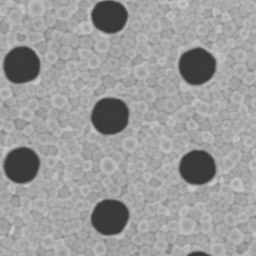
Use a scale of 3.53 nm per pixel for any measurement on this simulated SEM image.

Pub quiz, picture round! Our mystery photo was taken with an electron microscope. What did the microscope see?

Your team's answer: holes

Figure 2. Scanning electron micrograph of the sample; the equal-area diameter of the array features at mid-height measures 130 nm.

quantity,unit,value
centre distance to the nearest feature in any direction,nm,354